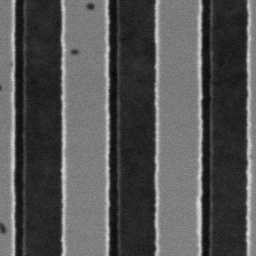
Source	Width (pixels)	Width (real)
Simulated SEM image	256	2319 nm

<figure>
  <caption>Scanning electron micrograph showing lines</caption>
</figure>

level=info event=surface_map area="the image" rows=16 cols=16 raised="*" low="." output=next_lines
*...***...***..*
*...***...***..*
*...***...***..*
*...***...***..*
*...***...***..*
*...***...***..*
*...***...***..*
*...***...***..*
*...***...***..*
*...***...***..*
*...***...***..*
*...***...***..*
*...***...***..*
*...***...***..*
*...***...***..*
*...***...***..*